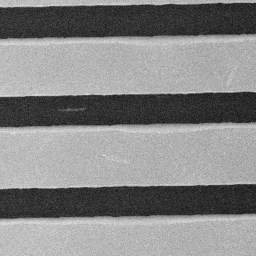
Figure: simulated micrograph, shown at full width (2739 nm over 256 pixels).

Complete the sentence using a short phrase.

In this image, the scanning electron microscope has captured lines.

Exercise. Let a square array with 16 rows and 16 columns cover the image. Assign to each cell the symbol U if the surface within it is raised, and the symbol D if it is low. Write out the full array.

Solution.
DDDDDDDDDDDDDDDD
DDDDDDDDDDDDDDDD
DUUUUUUUUUUUUUUU
UUUUUUUUUUUUUUUU
UUUUUUUUUUUUUUUU
UUUUUUUUUUUUUUUU
DDDDDDDDDDDDDDDD
DDDDDDDDDDDDDDDD
UUUUUUUUUUUUUUUU
UUUUUUUUUUUUUUUU
UUUUUUUUUUUUUUUU
UUUUUUUUUUUUUUUD
DDDDDDDDDDDDDDDD
DDDDDDDDDDDDUUUU
UUUUUUUUUUUUUUUU
UUUUUUUUUUUUUUUU